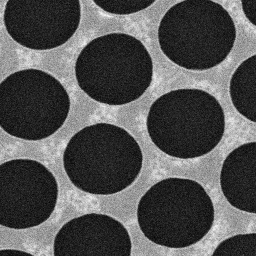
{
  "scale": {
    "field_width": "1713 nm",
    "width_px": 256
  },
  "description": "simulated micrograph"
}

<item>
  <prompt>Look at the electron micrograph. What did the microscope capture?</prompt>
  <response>holes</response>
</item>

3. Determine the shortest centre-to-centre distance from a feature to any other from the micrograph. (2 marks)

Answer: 604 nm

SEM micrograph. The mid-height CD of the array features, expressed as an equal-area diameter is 0.502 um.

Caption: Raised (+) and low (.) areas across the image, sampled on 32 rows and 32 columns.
+.........++.......+++.....+++..
+.........+++....++++.......+++.
..........++++++++++.........++.
+.........++++++++++.........+++
+........++++....+++.........+++
++......+++.......++.........+++
++++++++++.........+.........+++
++++++++++.........++.......+++.
+++++++++..........++++....+++..
+.....+++..........++++++++++...
........++.........++++++++++...
........+++.......+++.....+++...
.........+++.....++........++...
.........++++++++++.........+...
........++++++++++..........++..
........++++..++++..........++++
+......+++......+++.........++++
+++..++++........++.........++++
++++++++.........+++.......++...
++++++++..........+++....+++....
.....+++..........++++++++++....
......++..........++++++++++....
.......++........+++....++++....
.......+++......+++......+++....
.......+++++++++++........++....
.......++++++++++..........++...
.......++++++++++..........++++.
......+++.....+++..........+++++
+...++++........++........++++++
+++++++.........++........+++...
+++++++.........++++....+++.....
...++++.........+++++++++++.....